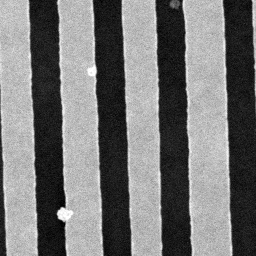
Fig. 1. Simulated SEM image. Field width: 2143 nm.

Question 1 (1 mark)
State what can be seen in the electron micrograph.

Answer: lines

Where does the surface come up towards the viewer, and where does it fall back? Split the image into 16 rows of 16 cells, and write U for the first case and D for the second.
UUDDUUDDUUDUUUDD
UUDDUUDDUUDDUUDD
UUDDUUDDUUDDUUDD
UUDDUUDDUUDDUUDD
UUDDUUDDUUDDUUDD
UUDDUUDDUUDDUUDD
UUDDUUDDUUDDUUDD
UUDDUUDDUUDDUUDD
UUDDUUDDUUDDUUDD
UUDDUUDDUUDDUUDD
UUDDUUDDUUDDUUDD
UUDDUUDDUUDDUUDD
UUDDUUDDUUDDUUDD
UUDDUUDDUUDDUUDD
UUDDUUDDUUDDUUDD
UUDDUUDDUUDDUUDD